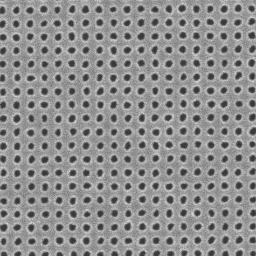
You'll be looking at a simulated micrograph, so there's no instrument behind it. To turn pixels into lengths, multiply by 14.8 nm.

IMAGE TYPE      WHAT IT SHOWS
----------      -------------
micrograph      a regular array of holes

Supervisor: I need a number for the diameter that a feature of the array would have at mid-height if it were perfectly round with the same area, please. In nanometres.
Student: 106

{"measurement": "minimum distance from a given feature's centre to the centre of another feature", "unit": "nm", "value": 196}